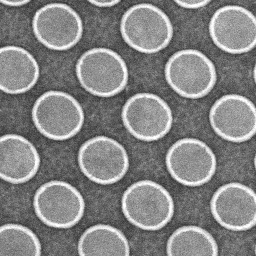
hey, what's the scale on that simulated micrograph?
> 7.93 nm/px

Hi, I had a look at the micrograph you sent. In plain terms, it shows a regular array of raised bodies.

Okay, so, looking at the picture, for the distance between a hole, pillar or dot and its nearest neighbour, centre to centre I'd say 0.489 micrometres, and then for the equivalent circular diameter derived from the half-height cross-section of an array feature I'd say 0.371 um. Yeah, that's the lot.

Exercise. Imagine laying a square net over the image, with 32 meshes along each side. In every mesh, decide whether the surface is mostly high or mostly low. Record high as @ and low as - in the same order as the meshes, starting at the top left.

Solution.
-@@---------@@---------@@@------
-----@@@@-------@@@@-------@@@@-
----@@@@@@-----@@@@@@------@@@@@
----@@@@@@-----@@@@@@-----@@@@@@
-----@@@@@-----@@@@@@------@@@@@
-----@@@@-------@@@@@------@@@@@
@@@--------@@@---------@@----@--
@@@@------@@@@@------@@@@@------
@@@@@-----@@@@@@-----@@@@@@-----
@@@@@-----@@@@@@-----@@@@@@-----
@@@@------@@@@@@-----@@@@@@-----
-@---------@@@@-------@@@@------
-----@@@@-------@@@@--------@@@-
----@@@@@@------@@@@@------@@@@@
----@@@@@@-----@@@@@@-----@@@@@@
-----@@@@@------@@@@@------@@@@@
-----@@@@@------@@@@@------@@@@@
@@@---------@@---------@-----@--
@@@@------@@@@@-------@@@@------
@@@@@-----@@@@@@-----@@@@@@-----
@@@@@-----@@@@@@-----@@@@@@-----
@@@@-------@@@@@-----@@@@@@-----
-@@---------@@@-------@@@@------
-----@@@@-------@@@@--------@@@-
-----@@@@@------@@@@@------@@@@@
----@@@@@@-----@@@@@@------@@@@@
-----@@@@@------@@@@@------@@@@@
-----@@@@@------@@@@@------@@@@@
@@@---------@@----@@---@-----@@-
@@@@------@@@@@-------@@@@------
@@@@@-----@@@@@@-----@@@@@@-----
@@@@@-----@@@@@@-----@@@@@@-----